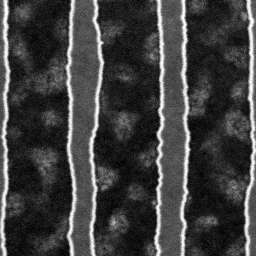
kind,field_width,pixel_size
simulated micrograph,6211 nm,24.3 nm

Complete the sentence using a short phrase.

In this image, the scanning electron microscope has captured one or a few lines or trenches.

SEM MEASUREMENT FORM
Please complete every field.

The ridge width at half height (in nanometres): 573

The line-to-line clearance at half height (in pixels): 65.6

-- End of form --